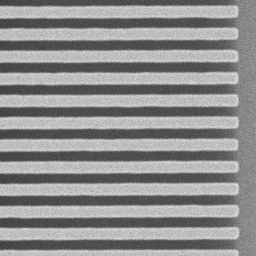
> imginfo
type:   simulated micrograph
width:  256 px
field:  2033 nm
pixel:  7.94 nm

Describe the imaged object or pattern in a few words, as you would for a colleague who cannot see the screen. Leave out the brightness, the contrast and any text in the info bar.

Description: groups of lines, slits or small figures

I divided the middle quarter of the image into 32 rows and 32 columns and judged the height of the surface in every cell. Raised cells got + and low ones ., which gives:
................................
................................
++++++++++++++++++++++++++++++++
++++++++++++++++++++++++++++++++
++++++++++++++++++++++++++++++++
................................
................................
................................
++++++++++++++++++++++++++++++++
++++++++++++++++++++++++++++++++
++++++++++++++++++++....+++.....
................................
................................
++++++++++++++++++++++++++++++++
++++++++++++++++++++++++++++++++
++++++++++++++++++++++++++++++++
................................
................................
................................
++++++++++++++++++++++++++++++++
++++++++++++++++++++++++++++++++
+++++++++++++++...+++++++++++.++
................................
................................
+.+++++++++.+++.++++++++++++++++
++++++++++++++++++++++++++++++++
++++++++++++++++++++++++++++++++
................................
................................
................................
++++++++++++++++++++++++++++++++
++++++++++++++++++++++++++++++++